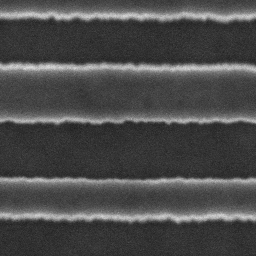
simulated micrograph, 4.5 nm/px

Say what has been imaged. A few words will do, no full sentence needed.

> lines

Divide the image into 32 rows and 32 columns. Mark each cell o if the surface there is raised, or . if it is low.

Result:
oooooooooooooooooooooooooooooooo
oooooooooooooooooooooooooooooooo
................................
................................
................................
................................
................................
................................
ooooooooo.ooooooooo....oo..oooo.
oooooooooooooooooooooooooooooooo
oooooooooooooooooooooooooooooooo
oooooooooooooooooooooooooooooooo
oooooooooooooooooooooooooooooooo
oooooooooooooooooooooooooooooooo
oooooooooooooooooooooooooooooooo
................................
................................
................................
................................
................................
................................
................................
ooo.o...ooo...........o.........
oooooooooooooooooooooooooooooooo
oooooooooooooooooooooooooooooooo
oooooooooooooooooooooooooooooooo
oooooooooooooooooooooooooooooooo
................................
................................
................................
................................
................................